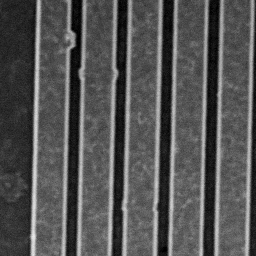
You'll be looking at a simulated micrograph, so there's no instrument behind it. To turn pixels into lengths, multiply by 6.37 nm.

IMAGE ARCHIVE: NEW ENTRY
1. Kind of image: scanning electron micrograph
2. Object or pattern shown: parallel lines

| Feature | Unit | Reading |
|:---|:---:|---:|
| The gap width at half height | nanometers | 94.7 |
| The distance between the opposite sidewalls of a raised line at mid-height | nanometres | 196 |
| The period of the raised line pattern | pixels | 45.8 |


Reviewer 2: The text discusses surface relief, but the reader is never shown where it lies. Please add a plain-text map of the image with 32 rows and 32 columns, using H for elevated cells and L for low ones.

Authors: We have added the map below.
LLLLLHHHHLLHHHLLHHHHLLHHHHLLHHHH
LLLLLHHHHLLHHHLLHHHHLLHHHHLLHHHL
LLLLLHHHHLLHHHLLHHHHLLHHHHLLHHHL
LLLLLHHHHLLHHHLLHHHHLLHHHHLLHHHL
LLLLLHHHHLLHHHLLHHHHLLHHHHLLHHHL
LLLLLHHHHLLHHHLLHHHHLLHHHHLLHHHL
LLLLLHHHHLLHHHLLHHHHLLHHHHLLHHHL
LLLLLHHHHLHHHHLLHHHHLLHHHHLLHHHL
LLLLLHHHLLHHHHLLHHHHLLHHHHLLHHHL
LLLLLHHHLLHHHHLLHHHHLLHHHHLLHHHL
LLLLLHHHLLHHHHLLHHHHLLHHHHLLHHHL
LLLLLHHHLLHHHHLLHHHHLLHHHHLHHHHL
LLLLLHHHLLHHHHLLHHHHLLHHHHLHHHHL
LLLLLHHHLLHHHHLLHHHHLLHHHLLHHHHL
LLLLHHHHLLHHHHLLHHHHLLHHHLLHHHHL
LLLLHHHHLLHHHHLLHHHHLLHHHLLHHHHL
LLLLHHHHLLHHHHLLHHHHLLHHHLLHHHHL
LLLLHHHHLLHHHHLLHHHHLLHHHLLHHHHL
LLLLHHHHLLHHHHLLHHHHLLHHHLLHHHHL
LLLLHHHHLLHHHHLLHHHHLLHHHLLHHHHL
LLLLHHHHLLHHHHLLHHHHLLHHHLLHHHHL
LLLLHHHHLLHHHHLLHHHHLLHHHLLHHHHL
LLLLHHHHLLHHHHLLHHHHLLHHHLLHHHHL
LLLLHHHHLLHHHHLLHHHHLLHHHLLHHHHL
LLLLHHHHLLHHHHLLHHHHLLHHHLLHHHHL
LLLLHHHHLLHHHHLLHHHHLHHHHLLHHHHL
LLLLHHHHLLHHHHLLHHHLLHHHHLLHHHHL
LLLLHHHHLLHHHHLLHHHLLHHHHLLHHHHL
LLLLHHHHLLHHHHLLHHHLLHHHHLLHHHHL
LLLLHHHHLLHHHHLLHHHLLHHHHLLHHHHL
LLLLHHHHLLHHHHLLHHHLLHHHHLLHHHHL
LLLLHHHHLLHHHHLLHHHLLHHHHLLHHHHL